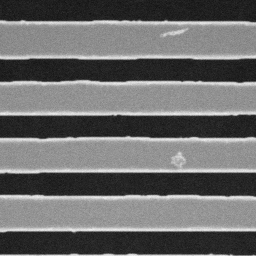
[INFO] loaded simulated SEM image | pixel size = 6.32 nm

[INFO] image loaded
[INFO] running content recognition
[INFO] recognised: lines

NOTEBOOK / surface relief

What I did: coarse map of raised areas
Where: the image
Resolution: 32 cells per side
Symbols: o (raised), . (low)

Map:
................................
................................
................................
oooooooooooooooooooooooooooooooo
oooooooooooooooooooooooooooooooo
oooooooooooooooooooooooooooooooo
oooooooooooooooooooooooooooooooo
................................
................................
................................
oooooooooooooooooooooooooooooooo
oooooooooooooooooooooooooooooooo
oooooooooooooooooooooooooooooooo
oooooooooooooooooooooooooooooooo
................................
................................
................................
oooooooooooooooooooooooooooooooo
oooooooooooooooooooooooooooooooo
oooooooooooooooooooooooooooooooo
oooooooooooooooooooooooooooooooo
...oo...........................
................................
................................
ooo...............oo.oooo.......
oooooooooooooooooooooooooooooooo
oooooooooooooooooooooooooooooooo
oooooooooooooooooooooooooooooooo
oooooooooooooooooooooooooooooooo
................................
................................
................................